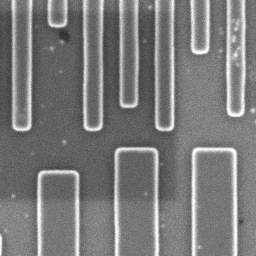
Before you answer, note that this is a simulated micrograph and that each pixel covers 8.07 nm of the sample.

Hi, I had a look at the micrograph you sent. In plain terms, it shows wiring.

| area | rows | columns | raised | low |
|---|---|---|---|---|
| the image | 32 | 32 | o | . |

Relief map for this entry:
..oo..oo...oo..oo..ooo..oo..oo..
..oo..oo...oo..oo..ooo..oo..oo..
..oo..oo...oo..oo..ooo..oo..ooo.
..oo.......oo..oo..ooo..oo..ooo.
..oo.......oo..oo..ooo..oo..oo..
..oo.......oo..oo..ooo..oo..oo..
..oo.......oo..oo..ooo..oo..oo..
..oo.......oo..oo..ooo......ooo.
..oo.......oo..oo..ooo......ooo.
..oo.......oo..oo..ooo......ooo.
..oo.......oo..oo..ooo......oo..
..oo.......oo..oo..ooo......oo..
..oo.......oo..oo..ooo......oo..
..oo.......oo......ooo......oo..
..oo.......oo......ooo..........
..oo.......oo......ooo..........
................................
................................
................................
..............oooooo....ooooo...
..............oooooo....ooooo...
.....oooo.....oooooo....ooooo...
.....ooooo....oooooo....ooooo...
.....ooooo....oooooo....ooooo...
.....ooooo....oooooo....ooooo...
.....ooooo....oooooo....ooooo...
.....ooooo....oooooo....ooooo...
.....ooooo....oooooo....ooooo...
.....ooooo....oooooo....ooooo...
.....ooooo.....ooooo....ooooo...
.....ooooo.....ooooo....ooooo...
.....ooooo.....ooooo....ooooo...